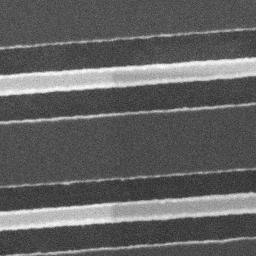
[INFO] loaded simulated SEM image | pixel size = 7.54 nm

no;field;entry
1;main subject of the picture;lines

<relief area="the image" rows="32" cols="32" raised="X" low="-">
XXXXXXXXXXXXXXXXXXXXXXXXXXXXXXXX
XXXXXXXXXXXXXXXXXXXXXXXXXXXXXXXX
XXXXXXXXXXXXXXXXXXXXXXXXXXXXXXXX
XXXXXXXXXXXXXXXXXXXXXXXXXXXXXXXX
XXXXXXXXXXXXXXXXXXXX------------
XXXXXXXX------------------------
--------------------------------
-----------------------------XXX
---------------XXXXXXXXXXXXXXXXX
XXXXXXXXXXXXXXXXXXXXXXXXXXXXXXX-
XXXXXXXXXXXXXXXXX---------------
XXXXX---------------------------
--------------------------------
-------------------------XXXXXXX
-----------XXXXXXXXXXXXXXXXXXXXX
XXXXXXXXXXXXXXXXXXXXXXXXXXXXXXXX
XXXXXXXXXXXXXXXXXXXXXXXXXXXXXXXX
XXXXXXXXXXXXXXXXXXXXXXXXXXXXXXXX
XXXXXXXXXXXXXXXXXXXXXXXXXXXXXXXX
XXXXXXXXXXXXXXXXXXXXXXXXXXXXXXXX
XXXXXXXXXXXXXXXXXXXXXXXXXXXXXXXX
XXXXXXXXXXXXXXXXXXXXXXXXXXXX----
XXXXXXXXXXXXX-------------------
--------------------------------
----------------------------XXXX
-------------XXXXXXXXXXXXXXXXXXX
--XXXXXXXXXXXXXXXXXXXXXXXXXXXX--
XXXXXXXXXXXXXXXXX---------------
XXX-----------------------------
--------------------------------
--------------------XXXXXXXXXXXX
-------XXXXXXXXXXXXXXXXXXXXXXXXX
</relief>